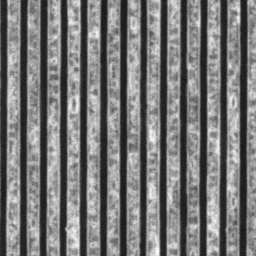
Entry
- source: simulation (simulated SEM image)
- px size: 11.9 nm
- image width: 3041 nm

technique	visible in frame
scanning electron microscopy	parallel lines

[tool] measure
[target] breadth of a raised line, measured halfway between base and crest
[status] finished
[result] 140 nanometers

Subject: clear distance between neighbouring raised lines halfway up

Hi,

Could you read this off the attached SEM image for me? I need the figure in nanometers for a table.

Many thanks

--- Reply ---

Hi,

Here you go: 93.6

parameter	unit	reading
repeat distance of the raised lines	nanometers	238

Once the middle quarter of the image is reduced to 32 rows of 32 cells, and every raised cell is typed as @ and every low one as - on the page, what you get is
-@@@--@@@--@@@--@@@--@@@--@@@--@
-@@@--@@@--@@@--@@@--@@@--@@@--@
-@@@--@@@--@@@--@@@--@@@--@@@--@
-@@@--@@@--@@@--@@@--@@@--@@@--@
-@@@--@@@--@@@--@@@--@@@--@@@--@
-@@@--@@@--@@@--@@@--@@@--@@@--@
-@@@--@@@--@@@--@@@--@@@--@@@--@
-@@@--@@@--@@@--@@@--@@@--@@@--@
-@@@--@@@--@@@--@@@--@@@--@@@--@
-@@@--@@@--@@@--@@@--@@@--@@@--@
-@@@--@@@--@@@--@@@--@@@--@@@--@
-@@@--@@@--@@@--@@@--@@@--@@@--@
-@@@--@@@--@@@--@@@--@@@--@@@--@
-@@@--@@@--@@@--@@@--@@@--@@@--@
-@@@--@@@--@@@--@@@--@@@--@@@--@
-@@@--@@@--@@@--@@@--@@@--@@@--@
-@@@--@@@--@@@--@@@--@@@--@@@--@
-@@@--@@@--@@@--@@@--@@@--@@@--@
-@@@--@@@--@@@--@@@--@@@--@@@--@
-@@@--@@@--@@@--@@@--@@@--@@@--@
-@@@--@@@--@@@--@@@--@@@--@@@--@
-@@@--@@@--@@@--@@@--@@@--@@@--@
-@@@--@@@--@@@--@@@--@@@--@@@--@
-@@@--@@@--@@@--@@@--@@@--@@@--@
-@@@--@@@--@@@--@@@--@@@--@@@--@
-@@@--@@@--@@@--@@@--@@@--@@@--@
-@@@--@@@--@@@--@@@--@@@--@@@--@
-@@@--@@@--@@@--@@@--@@@--@@@--@
-@@@--@@@--@@@--@@@--@@@--@@@--@
-@@@--@@@--@@@--@@@--@@@--@@@--@
-@@@--@@@--@@@--@@@--@@@--@@@--@
-@@@--@@@--@@@--@@@--@@@--@@@--@